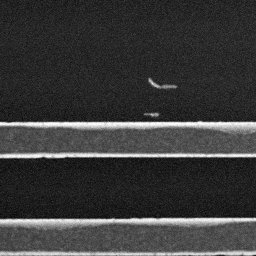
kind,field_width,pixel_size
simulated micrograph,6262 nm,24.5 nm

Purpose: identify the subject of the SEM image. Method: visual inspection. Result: lines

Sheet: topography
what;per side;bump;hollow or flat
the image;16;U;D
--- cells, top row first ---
DDDDDDDDDDDDDDDD
DDDDDDDDDDDDDDDD
DDDDDDDDDDDDDDDD
DDDDDDDDDDDDDDDD
DDDDDDDDDDDDDDDD
DDDDDDDDDDDDDDDD
DDDDDDDDDDDDDDDD
DDDDDDDDDDDDDDDD
UUUUUUUUUUUUUUUU
UUUUUUUUUUUUUUUU
DDDDDDDDDDDDDDDD
DDDDDDDDDDDDDDDD
DDDDDDDDDDDDDDDD
DDDDDDDDDDDDDDDD
UUUUUUUUUUUUUUUU
UUUUUUUUUUUUUUUU